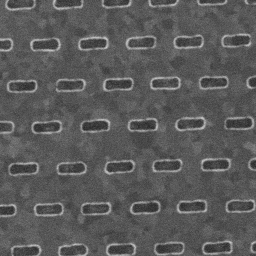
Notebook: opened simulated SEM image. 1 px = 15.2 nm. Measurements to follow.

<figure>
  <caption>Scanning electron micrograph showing a regular array of holes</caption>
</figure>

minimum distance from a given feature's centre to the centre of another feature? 0.717 micrometres